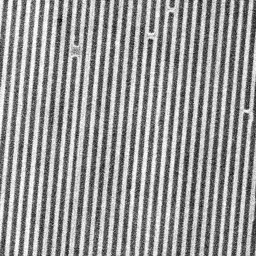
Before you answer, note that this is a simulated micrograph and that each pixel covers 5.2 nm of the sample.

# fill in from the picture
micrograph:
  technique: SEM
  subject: parallel lines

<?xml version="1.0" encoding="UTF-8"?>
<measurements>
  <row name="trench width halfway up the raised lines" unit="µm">0.0291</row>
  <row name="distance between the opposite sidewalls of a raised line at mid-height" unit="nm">19.4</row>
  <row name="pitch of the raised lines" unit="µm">0.048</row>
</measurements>